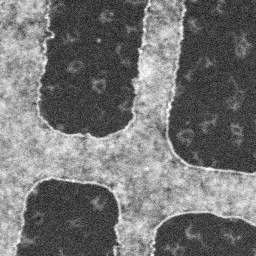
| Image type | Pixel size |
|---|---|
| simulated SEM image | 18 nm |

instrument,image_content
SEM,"one or a few lines or trenches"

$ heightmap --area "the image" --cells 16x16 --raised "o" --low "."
...oooooo..ooooo
...oooooo..ooooo
...oooooo..ooooo
...oooooo..ooooo
...oooooo..ooooo
..oooooo...ooooo
..oooooo...ooooo
...ooooo..oooooo
.....oo...oooooo
...........ooooo
.............ooo
..oooo..........
..ooooo.........
.oooooo....ooo..
.oooooo...oooooo
.oooooo...oooooo